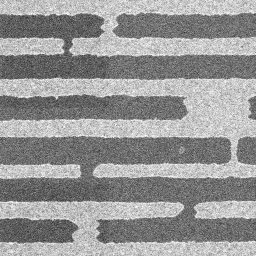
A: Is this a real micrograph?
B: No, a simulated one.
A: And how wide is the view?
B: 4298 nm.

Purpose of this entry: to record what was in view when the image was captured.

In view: parallel lines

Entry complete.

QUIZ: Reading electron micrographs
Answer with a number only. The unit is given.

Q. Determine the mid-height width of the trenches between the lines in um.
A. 0.416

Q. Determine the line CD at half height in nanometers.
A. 271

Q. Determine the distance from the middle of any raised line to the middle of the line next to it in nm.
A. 689